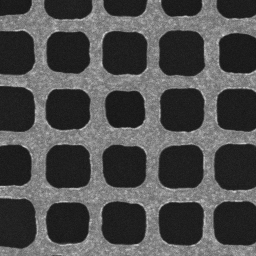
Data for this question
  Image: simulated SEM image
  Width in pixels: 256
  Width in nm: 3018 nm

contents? a regular array of holes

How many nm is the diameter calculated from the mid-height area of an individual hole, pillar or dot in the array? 555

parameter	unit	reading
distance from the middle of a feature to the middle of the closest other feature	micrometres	0.664